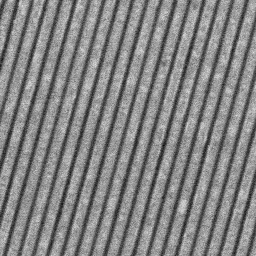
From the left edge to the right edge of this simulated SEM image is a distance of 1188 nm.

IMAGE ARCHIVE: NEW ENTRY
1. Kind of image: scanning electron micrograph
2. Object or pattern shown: parallel lines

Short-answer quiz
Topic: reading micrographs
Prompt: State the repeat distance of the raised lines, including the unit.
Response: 64 nm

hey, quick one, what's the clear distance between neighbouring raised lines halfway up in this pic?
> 24.1 nm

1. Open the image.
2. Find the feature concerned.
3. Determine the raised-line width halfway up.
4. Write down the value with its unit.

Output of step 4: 40.9 nanometres